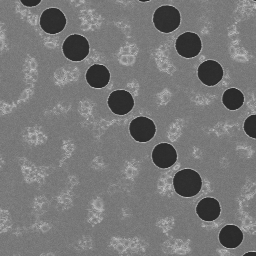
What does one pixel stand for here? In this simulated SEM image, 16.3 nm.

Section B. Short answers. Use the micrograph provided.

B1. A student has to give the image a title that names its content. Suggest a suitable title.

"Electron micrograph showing a regular array of holes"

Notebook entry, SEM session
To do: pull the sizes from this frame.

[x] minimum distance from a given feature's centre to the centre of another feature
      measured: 565 nm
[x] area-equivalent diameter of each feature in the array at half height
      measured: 25.5 px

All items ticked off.